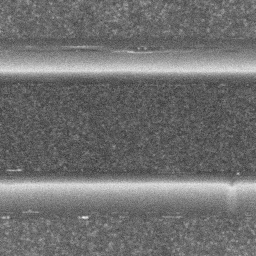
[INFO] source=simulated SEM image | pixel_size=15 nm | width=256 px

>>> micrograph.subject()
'one or a few lines or trenches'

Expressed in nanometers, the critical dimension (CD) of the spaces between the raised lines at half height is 1740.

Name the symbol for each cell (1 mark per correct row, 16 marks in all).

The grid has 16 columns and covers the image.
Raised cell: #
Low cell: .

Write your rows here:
################
################
################
################
................
................
................
................
................
................
................
................
################
################
################
################